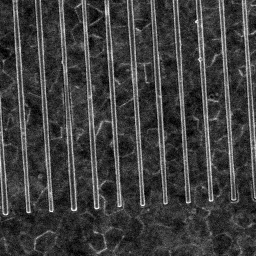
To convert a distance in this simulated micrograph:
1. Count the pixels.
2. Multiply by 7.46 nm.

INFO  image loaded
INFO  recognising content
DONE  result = parallel lines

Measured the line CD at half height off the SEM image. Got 33.5 nm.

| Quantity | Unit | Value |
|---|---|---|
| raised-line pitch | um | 0.17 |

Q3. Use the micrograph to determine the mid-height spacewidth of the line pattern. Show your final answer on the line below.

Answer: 137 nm